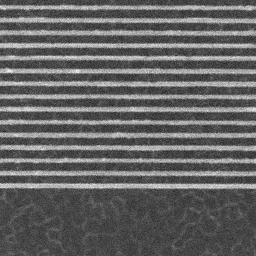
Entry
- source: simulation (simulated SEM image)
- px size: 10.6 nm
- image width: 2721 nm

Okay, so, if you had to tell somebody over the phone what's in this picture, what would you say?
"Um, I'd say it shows parallel lines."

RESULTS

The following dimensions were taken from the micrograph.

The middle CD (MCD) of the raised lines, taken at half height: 33.2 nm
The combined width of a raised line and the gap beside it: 136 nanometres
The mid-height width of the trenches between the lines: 99.6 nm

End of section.